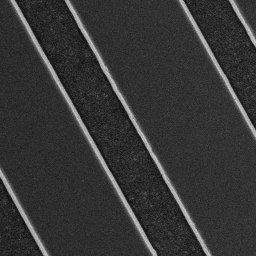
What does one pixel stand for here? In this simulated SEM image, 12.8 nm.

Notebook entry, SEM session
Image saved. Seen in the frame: one or a few lines or trenches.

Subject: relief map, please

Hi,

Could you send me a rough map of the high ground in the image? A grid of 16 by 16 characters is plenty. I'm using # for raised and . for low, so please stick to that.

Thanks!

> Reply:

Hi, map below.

#...########...#
##...#######...#
##....#######...
###...#######...
###....#######..
####...#######..
####....#######.
#####...#######.
######...#######
######...#######
#######...######
#######....#####
.#######...#####
.#######....####
..#######...####
...######....###